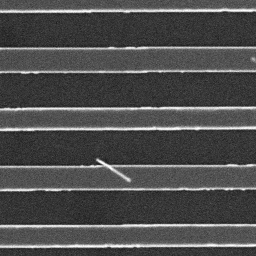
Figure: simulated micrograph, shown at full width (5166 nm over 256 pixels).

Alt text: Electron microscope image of lines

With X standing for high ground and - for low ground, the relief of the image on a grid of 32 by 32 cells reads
XXXXXXXXXXXXXXXXXXXXXXXXXXXXXXXX
--XX----------------------------
--------------------------------
--------------------------------
--------------------------------
--------------------------------
XXXXXXXXXXXXXXXXXXXXXXXXXXXXXXXX
XXXXXXXXXXXXXXXXXXXXXXXXXXXXXXXX
XXXXXXXXXXXXXXXXXXXXXXXXXXXXXXXX
--------------------------------
--------------------------------
--------------------------------
--------------------------------
--------------------------XXXXXX
XXXXXXXXXXXXXXXXXXXXXXXXXXXXXXXX
XXXXXXXXXXXXXXXXXXXXXXXXXXXXXXXX
--------------------------------
--------------------------------
--------------------------------
--------------------------------
--------------------------------
XXXXXXXXXXXXXXXXXXXXXXXXXXXXXXXX
XXXXXXXXXXXXXXXXXXXXXXXXXXXXXXXX
XXXXXXXXXXXXXXXXXXXXXXXXXXXXXXXX
--------------------------------
--------------------------------
--------------------------------
--------------------------------
XXXXXXXXXXXXXXXXXXXXXXXXXXXXXXXX
XXXXXXXXXXXXXXXXXXXXXXXXXXXXXXXX
XXXXXXXXXXXXXXXXXXXXXXXXXXXXXXXX
--------------------------------